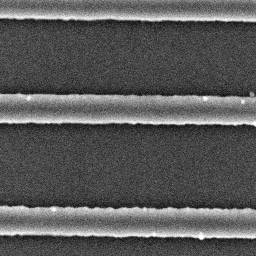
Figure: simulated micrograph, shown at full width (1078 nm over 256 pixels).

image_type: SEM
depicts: lines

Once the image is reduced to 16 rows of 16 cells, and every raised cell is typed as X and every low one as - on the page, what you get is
XXXXXXXXXXXXXXXX
----------------
----------------
----------------
----------------
----------------
XXXXXXXXXXXXXXXX
XXXXXXXXXXXXXXXX
----------------
----------------
----------------
----------------
----------------
XXXXXXXXXXXXXXXX
XXXXXXXXXXXXXXXX
----------------